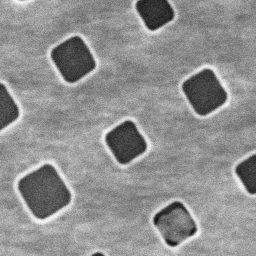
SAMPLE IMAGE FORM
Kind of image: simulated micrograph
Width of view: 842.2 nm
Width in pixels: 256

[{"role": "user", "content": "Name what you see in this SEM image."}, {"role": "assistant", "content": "holes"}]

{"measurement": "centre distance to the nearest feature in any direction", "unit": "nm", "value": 313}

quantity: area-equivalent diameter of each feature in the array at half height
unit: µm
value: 0.14